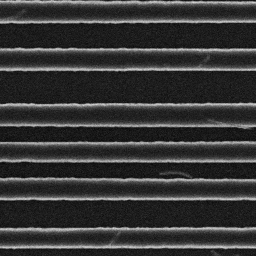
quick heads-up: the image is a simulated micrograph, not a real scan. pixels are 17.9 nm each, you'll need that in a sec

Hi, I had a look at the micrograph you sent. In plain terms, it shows lines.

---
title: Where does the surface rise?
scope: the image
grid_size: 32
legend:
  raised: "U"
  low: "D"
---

UUUUUUUUUUUUUUUUUUUUUUUUUUUUUUUU
UUUUUUUUUUUUUUUUUUUUUUUUUUUUUUUU
UUUUUUUUUUUUUUUUUUUUUUUUUUUUUUUU
DDDDDDDDDDDDDDDDDDDDDDDDDDDDDDDD
DDDDDDDDDDDDDDDDDDDDDDDDDDDDDDDD
DDDDDDDDDDDDDDDDDDDDDDDDDDDDDDDD
UUUUUUUUUUUUUUUUUUUUUUUUUUUUUUUU
UUUUUUUUUUUUUUUUUUUUUUUUUUUUUUUU
UUUUUUUUUUUUUUUUUUUUUUUUUUUUUUUU
DDDDDDDDDDDDDDDDDDDDDDDDDDDDDDDD
DDDDDDDDDDDDDDDDDDDDDDDDDDDDDDDD
DDDDDDDDDDDDDDDDDDDDDDDDDDDDDDDD
DDDDDDDDDDDDDDDDDDDDDDDDDDDDDDDD
UUUUUUUUUUUUUUUUUUUUUUUUUUUUUUUU
UUUUUUUUUUUUUUUUUUUUUUUUUUUUUUUU
UUUUUUUUUUUUUUUUUUUUUUUUUUUUUUUU
DDDDDDDDDDDDDDDDDDDDDDDDDDDDDDDD
DDDDDDDDDDDDDDDDDDDDDDDDDDDDDDDD
UUUUUUUUUUUUUUUUUUUUUUUUUUUUUUUU
UUUUUUUUUUUUUUUUUUUUUUUUUUUUUUUU
DDDDDDDDDDDDDDDDDDDDDDDDDDDDDDDD
DDDDDDDDDDDDDDDDDDDDDDDDDDDDDDDD
UUUUUUUUUUUUUUUUUUUUUUUUUUUUUUDU
UUUUUUUUUUUUUUUUUUUUUUUUUUUUUUUU
UUUUUUUUUUUUUUUUUUUUUUUUUUUUUUUU
DDDDDDDDDDDDDDDDDDDDDDDDDDDDDDDD
DDDDDDDDDDDDDDDDDDDDDDDDDDDDDDDD
DDDDDDDDDDDDDDDDDDDDDDDDDDDDDDDD
DDDDDDDDDDDDDDDDDDDDDDDDDDDDDDDD
UUUUUUUUUUUUUUUUUUUUUUUUUUUUUUUU
UUUUUUUUUUUUUUUUUUUUUUUUUUUUUUUU
DDDDDDDDDDDDDDDDDDDDDDDDDDDDDDDD